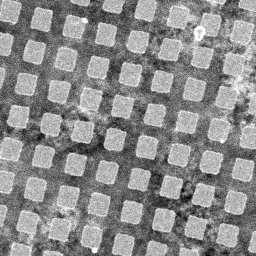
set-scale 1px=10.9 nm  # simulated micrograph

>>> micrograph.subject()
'a regular array of raised bodies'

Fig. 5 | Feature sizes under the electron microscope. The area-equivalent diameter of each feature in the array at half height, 0.237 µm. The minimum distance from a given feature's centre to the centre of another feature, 359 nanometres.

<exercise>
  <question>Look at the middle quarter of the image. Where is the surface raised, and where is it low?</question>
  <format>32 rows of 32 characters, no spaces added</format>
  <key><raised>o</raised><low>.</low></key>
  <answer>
oo....ooooo....oooo.............
oo....ooooo...ooooo.............
......oooo....ooooo....ooo......
.........o....ooooo....oooo.....
..............ooooo...ooooo....o
oo....................ooooo...oo
o....ooo..............oooo....oo
o....oooo.....................oo
o...ooooo....ooo..............oo
....ooooo....oooo...............
....ooooo...ooooo....oooo.......
.......o....ooooo....oooo.......
............oooo.....oooo....ooo
....................ooooo....ooo
...oo...............ooooo...oooo
...oooo.....................oooo
..ooooo....ooo..............oooo
..ooooo....oooo.................
..ooooo....oooo....ooo..........
.....o....ooooo....oooo.........
..........ooooo...ooooo....ooo..
.............o....ooooo....oooo.
.oo...............ooooo...ooooo.
.oooo................o....ooooo.
.oooo....oo...............ooooo.
.oooo....oooo...................
ooooo....oooo....ooo............
.ooo....ooooo....oooo...........
........ooooo....oooo....ooo....
..........oo....ooooo....oooo...
................ooooo....oooo...
oooo...............o....ooooo...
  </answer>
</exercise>